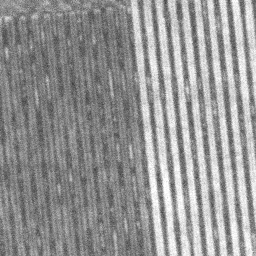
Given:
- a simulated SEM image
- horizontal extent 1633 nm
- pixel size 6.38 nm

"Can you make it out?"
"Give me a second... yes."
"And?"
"parallel lines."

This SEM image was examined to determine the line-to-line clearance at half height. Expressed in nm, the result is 53.9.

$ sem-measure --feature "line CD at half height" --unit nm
26.9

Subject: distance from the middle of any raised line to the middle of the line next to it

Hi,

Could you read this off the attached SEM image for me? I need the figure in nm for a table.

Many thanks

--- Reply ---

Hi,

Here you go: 80.2